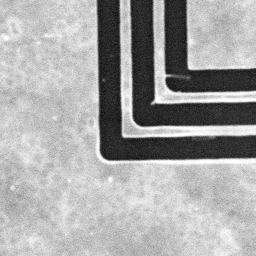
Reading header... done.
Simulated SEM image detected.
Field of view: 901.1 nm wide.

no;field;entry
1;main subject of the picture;groups of lines, slits or small figures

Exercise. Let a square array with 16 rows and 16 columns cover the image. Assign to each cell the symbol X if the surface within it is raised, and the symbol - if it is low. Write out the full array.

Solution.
XXXXXX------XXXX
XXXXXX------XXXX
XXXXXX------XXXX
XXXXXX------XXXX
XXXXXX----------
XXXXXX----X-----
XXXXXX----------
XXXXXX----------
XXXXXX--XX------
XXXXXX----------
XXXXXXXXXXXXXXXX
XXXXXXXXXXXXXXXX
XXXXXXXXXXXXXXXX
XXXXXXXXXXXXXXXX
XXXXXXXXXXXXXXXX
XXXXXXXXXXXXXXXX